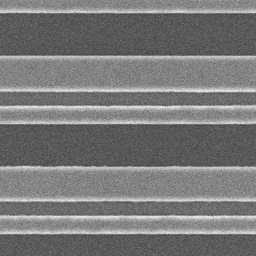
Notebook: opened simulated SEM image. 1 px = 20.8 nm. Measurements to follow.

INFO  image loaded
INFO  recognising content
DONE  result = lines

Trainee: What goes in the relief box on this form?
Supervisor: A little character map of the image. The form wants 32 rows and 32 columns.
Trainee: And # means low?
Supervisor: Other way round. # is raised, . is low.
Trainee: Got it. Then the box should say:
################################
#.##############################
................................
................................
................................
................................
................................
################################
################################
################################
################################
################################
################################
################################
################################
................................
................................
................................
................................
................................
................................
################################
################################
################################
################################
################################
################################
################################
################################
................................
................................
................................